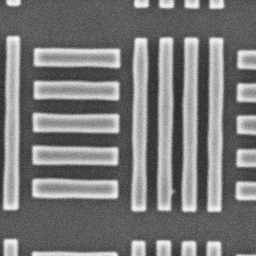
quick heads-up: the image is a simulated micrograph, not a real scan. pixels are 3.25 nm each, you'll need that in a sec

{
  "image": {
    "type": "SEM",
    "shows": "groups of lines, slits or small figures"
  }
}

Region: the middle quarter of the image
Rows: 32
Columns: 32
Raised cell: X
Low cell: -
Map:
-----------XXX---XXXX---XXX---XX
-----------------XXXX---XXX---XX
------------------XXX---XXX---XX
------------------XXX---XXX---XX
------------------XXX---XXX---XX
XXXXXXXXXXXXXX----XXX---XXX---XX
XXXXXXXXXXXXXX----XXX---XXX---XX
XXXXXXXXXXXXXX----XXX---XXX---XX
-XXXXXXXXXXXXX----XXX---XXX---XX
------------------XXX---XXX---XX
------------------XXX---XXX---XX
-----------------XXXX---XXX---XX
-----------------XXXX---XXX---XX
XXXXXXXXXXXXXX---XXXX---XXX---XX
XXXXXXXXXXXXXX---XXXX---XXX---XX
XXXXXXXXXXXXXX---XXXX---XXX---XX
XXXXXXXXXXXXXX---XXXX---XXX---XX
-----------------XXXX---XXX---XX
-----------------XXXX---XXX---XX
-----------------XXX----XXX---XX
-----------------XXX----XXX---XX
XXXXXXXXXXXXX----XXX----XXX---XX
XXXXXXXXXXXXX----XXX----XXX---XX
XXXXXXXXXXXXX-----XX----XXX---XX
XXXXXXXXXXXXX-----XX----XXX---XX
------------------XX----XXX---XX
-----------------XXX----XXX---XX
-----------------XXX----XXX---XX
-----------------XXX----XXX---XX
XXXXXXXXXXXXX----XXX----XXX---XX
XXXXXXXXXXXXX----XXX----XXX---XX
XXXXXXXXXXXXX----XXX----XXX---XX